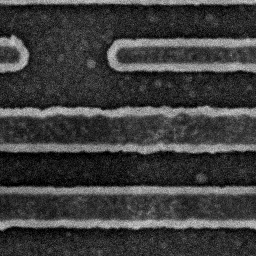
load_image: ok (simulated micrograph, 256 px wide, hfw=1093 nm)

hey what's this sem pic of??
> one or a few lines or trenches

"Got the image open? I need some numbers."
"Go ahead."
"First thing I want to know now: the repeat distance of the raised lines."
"326 nanometres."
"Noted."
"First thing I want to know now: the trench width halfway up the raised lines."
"186 nm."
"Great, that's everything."